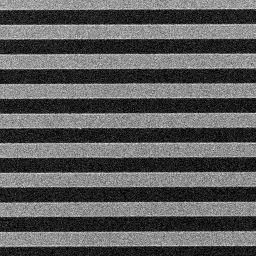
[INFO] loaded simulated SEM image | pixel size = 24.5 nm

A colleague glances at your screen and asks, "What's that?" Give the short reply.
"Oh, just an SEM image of parallel lines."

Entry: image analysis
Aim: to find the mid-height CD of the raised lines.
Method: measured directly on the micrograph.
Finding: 343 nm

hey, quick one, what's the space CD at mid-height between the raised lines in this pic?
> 389 nm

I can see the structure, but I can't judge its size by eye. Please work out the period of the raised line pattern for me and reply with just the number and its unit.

29.6 pixels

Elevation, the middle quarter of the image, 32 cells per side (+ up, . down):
++++++++++++++++++++++++++++++++
................................
................................
................................
................................
++++++++++++++++++++++++++++++++
++++++++++++++++++++++++++++++++
++++++++++++++++++++++++++++++++
................................
................................
................................
................................
................................
++++++++++++++++++++++++++++++++
++++++++++++++++++++++++++++++++
++++++++++++++++++++++++++++++++
................................
................................
................................
................................
++++++++++++++++++++++++++++++++
++++++++++++++++++++++++++++++++
++++++++++++++++++++++++++++++++
................................
................................
................................
................................
++++++++++++++++++++++++++++++++
++++++++++++++++++++++++++++++++
++++++++++++++++++++++++++++++++
++++++++++++++++++++++++++++++++
................................